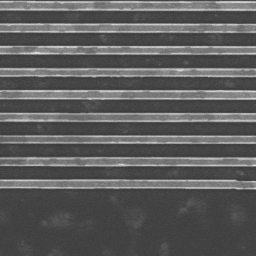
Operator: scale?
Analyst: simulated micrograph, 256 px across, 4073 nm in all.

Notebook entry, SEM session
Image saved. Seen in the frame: parallel lines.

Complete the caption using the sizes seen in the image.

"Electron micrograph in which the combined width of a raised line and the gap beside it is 354 nm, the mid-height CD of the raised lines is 129 nanometers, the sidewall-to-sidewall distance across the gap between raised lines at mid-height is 229 nanometers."